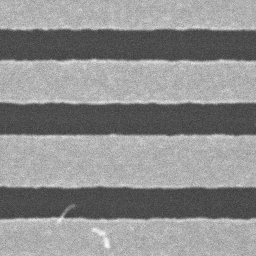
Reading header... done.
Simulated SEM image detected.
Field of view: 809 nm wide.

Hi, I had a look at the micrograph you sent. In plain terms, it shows lines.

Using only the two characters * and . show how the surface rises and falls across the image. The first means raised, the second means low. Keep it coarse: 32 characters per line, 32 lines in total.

********************************
********************************
********************************
********************************
................................
................................
................................
...........***..................
********************************
********************************
********************************
********************************
********************************
................................
................................
................................
................................
********************************
********************************
********************************
********************************
********************************
********************************
................................
................................
................................
................................
.**********....*...***.***.**..*
********************************
********************************
********************************
********************************